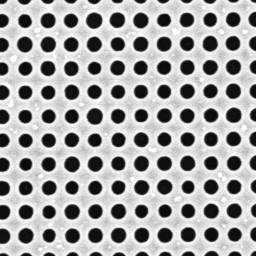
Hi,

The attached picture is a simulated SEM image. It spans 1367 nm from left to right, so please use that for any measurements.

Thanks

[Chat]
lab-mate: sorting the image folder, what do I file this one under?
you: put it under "a regular array of holes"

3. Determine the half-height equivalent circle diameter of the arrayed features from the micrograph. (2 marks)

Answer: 80.3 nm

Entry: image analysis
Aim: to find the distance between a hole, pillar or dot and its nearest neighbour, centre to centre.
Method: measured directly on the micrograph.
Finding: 123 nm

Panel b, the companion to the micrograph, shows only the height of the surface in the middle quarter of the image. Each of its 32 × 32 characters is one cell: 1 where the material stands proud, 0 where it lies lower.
00001100011100011000011000011000
00001100011000011000011000011000
00011110011100011100111100111100
11111111111111111111111111111111
11111111111111111111111111111111
10011110011100111100111100111000
00001100011100011000011000011000
00001100011100011000011000011000
10011110011110111100111100111100
11111111111111111111111111111111
11111111111111111111111111111111
10011100011100111100111100111100
00001100001100011100011000011000
00001100001100011100011000011000
10011100011100011100111100111100
11111111111111111111111111111111
11111111111111111111111111111111
10011110011110011100111100111100
00001100011100011000011000011000
00001100011100011000011000011000
10011110011100011100111100111100
11111111111111111111111111111111
11111111111111111111111111111111
10011110011100011100011100111100
00001100001100011000011000011000
00001100001100011100011000011000
10011110011110011100011100111100
11111111111111111111111111111111
11111111111111111111111111111111
10011110011100011100011100011100
00001100001100011100011000011000
00001100001100011100011000011100